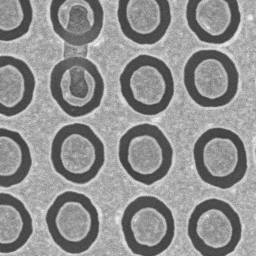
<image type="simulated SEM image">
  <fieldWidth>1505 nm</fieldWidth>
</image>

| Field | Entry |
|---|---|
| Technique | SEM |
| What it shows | ring-shaped grooves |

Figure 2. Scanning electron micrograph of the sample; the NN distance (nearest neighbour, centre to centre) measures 402 nanometres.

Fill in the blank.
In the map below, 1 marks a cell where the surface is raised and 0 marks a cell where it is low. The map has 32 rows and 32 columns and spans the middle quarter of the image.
00000000111111100000000000111100
00000000011111100011111000011100
10000110011111000111111100011100
10000110001111000111111110011100
10000010001111000111111110001100
10000010001111000111111110001100
10000010001111000111111110001110
11000010001111000111111110011110
11110110001111100011111100011111
01111100011111110001111100011111
00011000011111110000000000111111
00000000111111111000000001111111
10000011111111111110000011111111
11111111111111111111111111111111
11111111111111111111111111111111
00000011111111111100000111111111
00000001111111110000000011111111
00000000111111100000000001111111
01111000011111000011110000111111
11111100001111000111111000111111
11111110001111001111111100011111
11111111001111001111111100011111
11111111001111001111111100011111
11111111001111001111111100011111
11111110001111001111111100011111
11111110001111100111111100011111
01111100011111100011111000111111
00000000111111110000000000111111
00000000111111111000000001111111
11000011111111111110000111111111
11111111111111111111111111111111
11111111111111111111111111111111